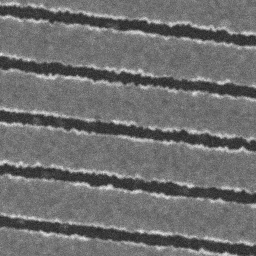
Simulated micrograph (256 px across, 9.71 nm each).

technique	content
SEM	parallel lines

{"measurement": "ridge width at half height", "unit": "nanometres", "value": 394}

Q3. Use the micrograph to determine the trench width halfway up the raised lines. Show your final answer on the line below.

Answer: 113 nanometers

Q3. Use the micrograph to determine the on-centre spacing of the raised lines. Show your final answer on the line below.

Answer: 509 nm